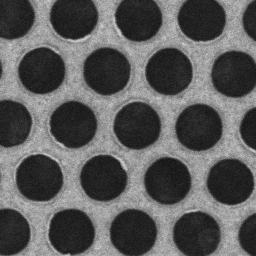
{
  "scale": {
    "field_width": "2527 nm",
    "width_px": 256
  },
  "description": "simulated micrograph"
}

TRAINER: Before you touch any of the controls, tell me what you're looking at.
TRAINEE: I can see a regular array of holes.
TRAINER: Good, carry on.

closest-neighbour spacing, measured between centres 614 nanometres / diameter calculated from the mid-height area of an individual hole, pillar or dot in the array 466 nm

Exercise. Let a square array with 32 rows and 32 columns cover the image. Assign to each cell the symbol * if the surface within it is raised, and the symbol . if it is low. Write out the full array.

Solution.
....***.....***.....***....****.
....**......**......**......***.
....**......**......**......**..
....***.....***.....**......**..
...*****...*****...****....****.
********************************
****...*****...*****...*****..**
***.....***.....***.....***.....
**......**......**......***.....
**......**......**......**......
***.....***.....***.....***.....
****..******...*****...****....*
.*******************************
...****....****....****....*****
....**......**......**.....****.
....**......**......**......**..
....**......**......**......**..
...****....****.....**.....***..
********..******..*****...*****.
****..******..******************
***....****....****....****...**
**......**......**......**.....*
**......**......**......**......
**......**......**......**......
***....****....****....****....*
********************..******..**
..*****...*****...******.*******
...***.....***.....***.....****.
....**......**......**.....***..
....**......**......**......**..
....**.....***.....***.....***..
...****...*****...*****....****.